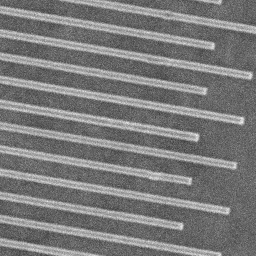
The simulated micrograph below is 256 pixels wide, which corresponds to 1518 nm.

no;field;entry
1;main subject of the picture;parallel lines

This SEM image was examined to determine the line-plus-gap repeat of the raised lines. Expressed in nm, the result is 136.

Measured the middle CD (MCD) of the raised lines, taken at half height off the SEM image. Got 35.8 nm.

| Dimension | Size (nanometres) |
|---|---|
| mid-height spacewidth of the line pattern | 97.9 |